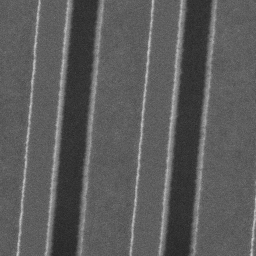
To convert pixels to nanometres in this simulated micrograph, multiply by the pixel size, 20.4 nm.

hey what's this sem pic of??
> lines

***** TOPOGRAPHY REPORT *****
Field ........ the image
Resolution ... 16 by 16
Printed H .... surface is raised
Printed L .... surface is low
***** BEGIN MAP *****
HHHHLLHHHHHLLHHH
HHHHLLHHHHHLLHHH
HHHHLLHHHHHLLHHH
HHHHLLHHHHHLLHHH
HHHHLLHHHHHLLHHH
HHHHLLHHHHHLLHHH
HHHHLLHHHHHLLHHH
HHHHLLHHHHHLLHHH
HHHHLLHHHHHLLHHH
HHHHLLHHHHHLLHHH
HHHLLHHHHHLLLHHH
HHHLLHHHHHLLHHHH
HHHLLHHHHHLLHHHH
HHHLLHHHHHLLHHHH
HHHLLHHHHHLLHHHH
HHHLLHHHHHLLHHHH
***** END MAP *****